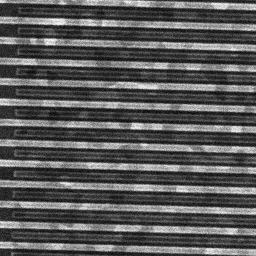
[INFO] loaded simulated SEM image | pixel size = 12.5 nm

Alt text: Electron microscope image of parallel lines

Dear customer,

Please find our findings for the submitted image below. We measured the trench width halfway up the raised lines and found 56.1 nanometres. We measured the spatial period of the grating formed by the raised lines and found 128 nanometres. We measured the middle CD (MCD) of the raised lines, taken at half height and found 67 nm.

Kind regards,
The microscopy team